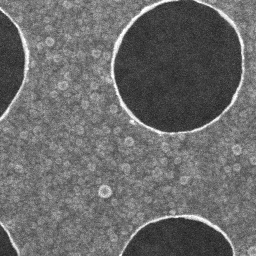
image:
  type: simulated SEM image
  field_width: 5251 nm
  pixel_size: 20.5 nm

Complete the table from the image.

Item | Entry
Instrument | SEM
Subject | holes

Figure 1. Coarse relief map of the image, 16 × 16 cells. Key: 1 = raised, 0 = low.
1111111111000111
0111111100000011
0111111100000001
0011111000000001
0011111000000001
0111111000000001
0111111100000011
1111111110000111
1111111111111111
1111111111111111
1111111111111111
1111111111111111
1111111111111111
1111111111111111
1111111110000011
0111111100000011